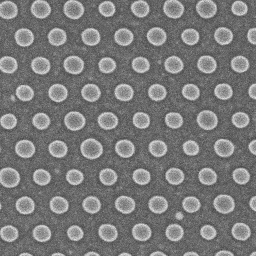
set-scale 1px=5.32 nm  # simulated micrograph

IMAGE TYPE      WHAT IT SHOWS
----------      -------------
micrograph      a regular array of raised bodies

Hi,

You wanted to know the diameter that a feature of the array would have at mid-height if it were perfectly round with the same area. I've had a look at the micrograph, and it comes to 90.6 nanometers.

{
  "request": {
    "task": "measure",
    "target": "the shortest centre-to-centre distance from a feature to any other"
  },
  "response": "32.3 px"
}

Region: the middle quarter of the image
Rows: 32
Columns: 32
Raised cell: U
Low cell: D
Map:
UUUUUDDDDUUUUDDDDUUUUDDDDUUUUUDD
UUUUUDDDDUUUDDDDDDUUUDDDDDUUUDDD
DDDDDDDDDDDDDDDDDDDDDDDDDDDDDDDD
DDDDDDDDDDDDDDDDDDDDDDDDDDDDDDDD
DDDDDDDDDDDDDDDDDDDDDDDDDDDDDDDD
DDDDDUUUDDDDDDUUDDDDDDUUDDDDDDUU
UDDDDUUUUDDDDUUUUDDDDUUUUDDDDDUU
UDDDDUUUUDDDDUUUUDDDDUUUUDDDDDUU
DDDDDUUUUDDDDUUUUDDDDDUUUDDDDDDU
DDDDDDDDDDDDDDDDDDDDDDDDDDDDDDDD
DDDDDDDDDDDDDDDDDDDDDDDDDDDDDDDD
DDDDDDDDDDDDDDDDDDDDDDDDDDDDDDDD
DUUUDDDDDDUUDDDDDDUUUDDDDDUUUDDD
UUUUUDDDDUUUUDDDDUUUUDDDDUUUUDDD
UUUUUDDDDUUUUDDDDUUUUDDDDDUUUDDD
DUUUUDDDDUUUUDDDDDUUUDDDDDUUUDDD
DDDDDDDDDDDDDDDDDDDDDDDDDDDDDDDD
DDDDDDDDDDDDDDDDDDDDDDDDDDDDDDDD
DDDDDDDDDDDDDDDDDDDDDDDDDDDDDDDD
DDDDDUUUUDDDDDUUUDDDDDUUDDDDDDDU
UDDDUUUUUDDDDUUUUDDDDUUUUDDDDDUU
UDDDUUUUUUDDDUUUUDDDDDUUUUDDDDUU
DDDDDUUUUDDDDDUUUDDDDDUUUDDDDDDU
DDDDDDUUDDDDDDDDDDDDDDDDDDDDDDDD
DDDDDDDDDDDDDDDDDDDDDDDDDDDDDDDD
DDDDDDDDDDDDDDDDDDDDDDDDDDDDDDDD
DDUDDDDDDDUUDDDDDDUUDDDDDDUUUDDD
DUUUDDDDDUUUUDDDDUUUUDDDDUUUUUDD
DUUUUDDDDUUUUDDDDUUUUDDDDUUUUUDD
DUUUDDDDDUUUUDDDDDUUUDDDDDUUUDDD
DDDDDDDDDDDDDDDDDDDDDDDDDDDDDDDD
DDDDDDDDDDDDDDDDDDDDDDDDDDDDDDDD